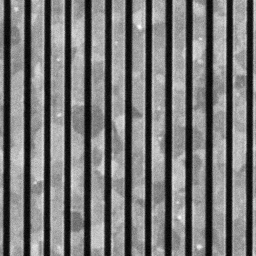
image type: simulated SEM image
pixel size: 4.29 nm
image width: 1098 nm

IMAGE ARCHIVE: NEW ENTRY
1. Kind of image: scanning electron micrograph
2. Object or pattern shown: parallel lines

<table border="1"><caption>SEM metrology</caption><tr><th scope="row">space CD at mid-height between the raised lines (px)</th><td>7.76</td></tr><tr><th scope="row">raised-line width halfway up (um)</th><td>0.0542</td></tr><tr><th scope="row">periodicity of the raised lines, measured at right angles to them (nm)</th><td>86.8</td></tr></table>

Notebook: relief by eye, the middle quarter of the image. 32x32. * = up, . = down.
..***..***..***..***..***..***..
..***..***..***..***..***..***..
..***..***..***..***..***..***..
..***..***..***..***..***..***..
..***..***..***..***..***..***..
..***..***..***..***..***..***..
..***..***..***..***..***..***..
..***..***..***..***..***..***..
..***..***..***..***..***..***..
..***..***..***..***..***..***..
..***..***..***..***..***..***..
..***..***..***..***..***..***..
..***..***..***..***..***..***..
..***..***..***..***..***..***..
..***..***..***..***..***..***..
..***..***..***..***..***..***..
..***..***..***..***..***..***..
..***..***..***..***..***..***..
..***..***..***..***..***..***..
..***..***..***..***..***..***..
..***..***..***..***..***..***..
..***..***..***..***..***..***..
..***..***..***..***..***..***..
..***..***..***..***..***..***..
..***..***..***..***..***..***..
..***..***..***..***..***..***..
..***..***..***..***..***..***..
..***..***..***..***..***..***..
..***..***..***..***..***..***..
..***..***..***..***..***..***..
..***..***..***..***..***..***..
..***..***..***..***..***..***..